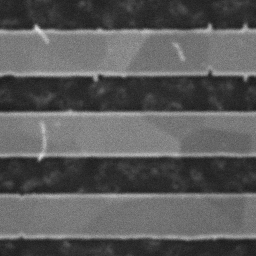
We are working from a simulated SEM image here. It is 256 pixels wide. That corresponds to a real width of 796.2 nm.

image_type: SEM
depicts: one or a few lines or trenches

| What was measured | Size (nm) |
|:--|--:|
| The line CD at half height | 133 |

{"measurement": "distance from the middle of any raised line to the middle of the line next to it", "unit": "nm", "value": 255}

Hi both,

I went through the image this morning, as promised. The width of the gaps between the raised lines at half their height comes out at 122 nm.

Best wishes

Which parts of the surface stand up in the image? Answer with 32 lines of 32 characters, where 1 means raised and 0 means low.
00000000000000000000000000000000
00000000000000000000000000000000
00000000000000000000000000000000
00000000000000000000000000000000
11111111111111111111111111111111
11111111111111111111111111111111
11111111111111111111111111111111
11111111111111111111111111111111
11111111111111111111111111111111
00000000000000000000000000000010
00000000000000000000000000000000
00000000000000000000000000000000
00000000000000000000000000000000
00000000000000000000000000000000
11111111111111111111111111111111
11111111111111111111111111111111
11111111111111111111111111111111
11111111111111111111111111111111
11111111111111111111111111111111
00000100000000000000000000000000
00000000000000000000000000000000
00000000000000000000000000000000
00000000000000000000000000000000
00000000000000000000000000000000
11111111111111111111111111111111
11111111111111111111111111111111
11111111111111111111111111111111
11111111111111111111111111111111
11111111111111111111111111111111
11111111111111111111111111111111
00000000000000000000000000000000
00000000000000000000000000000000